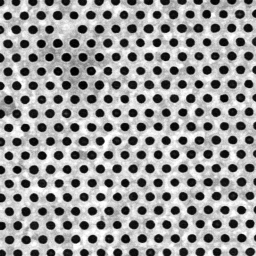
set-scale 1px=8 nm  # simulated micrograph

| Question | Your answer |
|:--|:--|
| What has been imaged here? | a regular array of holes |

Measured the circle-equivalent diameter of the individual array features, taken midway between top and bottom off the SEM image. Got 75.5 nm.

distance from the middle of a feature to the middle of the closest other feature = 0.128 microns